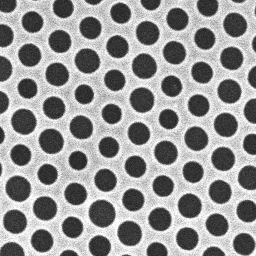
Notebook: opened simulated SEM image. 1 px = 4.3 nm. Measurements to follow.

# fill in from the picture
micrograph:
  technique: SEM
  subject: a regular array of holes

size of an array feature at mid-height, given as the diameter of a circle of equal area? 99.8 nm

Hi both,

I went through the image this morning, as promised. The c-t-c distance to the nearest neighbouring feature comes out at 142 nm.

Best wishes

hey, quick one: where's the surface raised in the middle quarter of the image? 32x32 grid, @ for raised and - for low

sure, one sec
@@@------@@@@@@@@------@@@@@@@@@
-@@@----@@@@--@@@------@@@@@@@@@
-@@@@-@@@@-----@@------@@@@@@@@@
-@@@@@@@@@-----@@@@---@@@----@@@
-@@@@@@@@@-----@@@@@@@@@-----@@@
@@@@--@@@@-----@@@@@@@@@------@@
@@@----@@@@@--@@@@---@@@-----@@@
@@@----@@@@@@@@@@-----@@@----@@@
@@@----@@@@@@@@@-------@@@@@@@@-
@@@@---@@@@@@@@@-------@@@@@@@@-
@@@@@@@@@@----@@@-----@@@@@@@@@-
@@@@@@@@@@----@@@@----@@@--@@@@-
@@@@@@@@@------@@@@@@@@@----@@@@
@@----@@@@----@@@@@@@@@@-----@@@
@@-----@@@----@@@@-@@@@@-----@@@
@------@@@@@@@@@-----@@@----@@@@
@------@@@@@@@@@-----@@@@@@@@@@-
@@-----@@@@@@@@@------@@@@@@@@--
@@@---@@@@--@@@@-----@@@@@@@@@--
@@@@@@@@@----@@@@----@@@---@@@--
@@@@@@@@------@@@@@@@@@-----@@@-
@@@@@@@@@-----@@@@@@@@@-----@@@@
@@---@@@@----@@@@@@@@@@------@@@
@-----@@@@@-@@@@----@@@-----@@@@
@-----@@@@@@@@@-----@@@@----@@@-
@@----@@@@@@@@@------@@@@@@@@@--
@@@-@@@@@---@@@------@@@@@@@@@--
@@@@@@@@-----@@@----@@@@@@@@@@--
@@@@@@@------@@@@--@@@@----@@@--
@@@@@@@@-----@@@@@@@@@-----@@@@-
@----@@@-----@@@@@@@@@------@@@@
------@@@---@@@@---@@@-----@@@@@